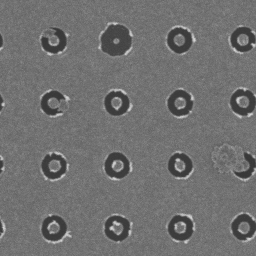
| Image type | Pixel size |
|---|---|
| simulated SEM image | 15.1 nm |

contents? a regular array of ring-shaped grooves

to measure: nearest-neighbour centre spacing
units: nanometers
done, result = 937